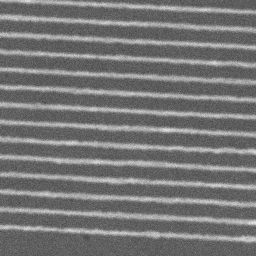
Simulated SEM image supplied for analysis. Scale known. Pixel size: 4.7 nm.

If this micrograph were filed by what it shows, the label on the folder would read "parallel lines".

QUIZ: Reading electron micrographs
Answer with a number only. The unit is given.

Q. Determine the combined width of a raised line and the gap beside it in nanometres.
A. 82.1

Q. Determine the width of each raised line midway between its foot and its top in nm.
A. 16.4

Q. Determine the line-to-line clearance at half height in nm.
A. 66.9